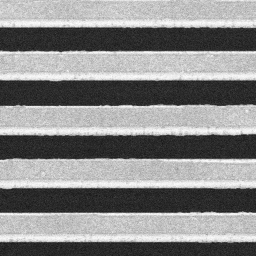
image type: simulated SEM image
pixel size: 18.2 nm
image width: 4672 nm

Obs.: lines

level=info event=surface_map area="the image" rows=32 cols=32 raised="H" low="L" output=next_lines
HHHHHHHHHHHHHHHHHHHHHHHHHHHHHHHH
HHHHHHHHHHHHHHHHHHHHHHHHHHHHHHHH
HHHHHHHHHHHHHHHHHHHHHHHHHHHHHHHH
LLLLLLLLLLLLLLLLLLLLLLLLLLLLLLLL
LLLLLLLLLLLLLLLLLLLLLLLLLLLLLLLL
LLLLLLLLLLLLLLLLLLLLLLLLLLLLLLLL
LLLLLLLLLLLLHLLLLHHHLHHHHHHHHHHL
HHHHHHHHHHHHHHHHHHHHHHHHHHHHHHHH
HHHHHHHHHHHHHHHHHHHHHHHHHHHHHHHH
HHHHHHHHHHHHHHHHHHHHHHHHHHHHHHHH
LLLLLLLLLLLLLLLLLLLLLLLLLLLLLLLL
LLLLLLLLLLLLLLLLLLLLLLLLLLLLLLLL
LLLLLLLLLLLLLLLLLLLLLLLLLLLLLLLL
HHHHHHHHHHHHHHHHHHHHHHHHHHHHHHHH
HHHHHHHHHHHHHHHHHHHHHHHHHHHHHHHH
HHHHHHHHHHHHHHHHHHHHHHHHHHHHHHHH
HHHHHHHHHHHHHHHHHHHHHHHHHHHHHHHH
LLLLLLLLLLLLLLLLLLLLLLLLLLLLLLLL
LLLLLLLLLLLLLLLLLLLLLLLLLLLLLLLL
LLLLLLLLLLLLLLLLLLLLLLLLLLLLLLLL
HHHHHHHHHHHHHHHHHHHHHHHHHHHHHHHH
HHHHHHHHHHHHHHHHHHHHHHHHHHHHHHHH
HHHHHHHHHHHHHHHHHHHHHHHHHHHHHHHH
LLLLLLLLLLLLLLLLLLLLLLLLLLLLLLLL
LLLLLLLLLLLLLLLLLLLLLLLLLLLLLLLL
LLLLLLLLLLLLLLLLLLLLLLLLLLLLLLLL
LLLLLLLLLLLLLLLLLLLLLLLLLLLLLLLL
HHHHHHHHHHHHHHHHHHHHHHHHHHHHHHHH
HHHHHHHHHHHHHHHHHHHHHHHHHHHHHHHH
HHHHHHHHHHHHHHHHHHHHHHHHHHHHHHHH
LLLLLLLLLLLLLLLLLLLLLLLLLLLLLLLL
LLLLLLLLLLLLLLLLLLLLLLLLLLLLLLLL